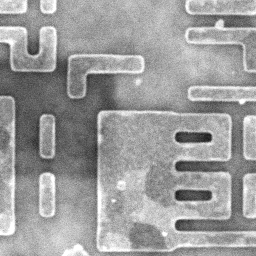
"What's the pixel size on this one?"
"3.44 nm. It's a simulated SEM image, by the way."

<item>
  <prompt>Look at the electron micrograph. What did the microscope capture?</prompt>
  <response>wiring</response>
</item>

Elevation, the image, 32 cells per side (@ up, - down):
@@@--@@----------------@@@@@@@@@
@@@---------------------@@@@@@@@
--------------------------------
@@@--@-------------------@@@----
@@@--@@----------------@@@@@@@@@
-@@--@@-----------------------@@
-@@--@@------------------------@
-@@@@@@--@@@@@@@@@-------------@
--@@@@@--@@@@@@@@@-------------@
---------@@---------------------
---------@@---------------------
---------@@-------------@@@@@@@@
@@----------------------@@@@@@@@
@@------------------------------
@@---@------@@@@@@@@@@@@@@@@----
@@---@@-----@@@@@@@@@@@@@@@@@--@
@@---@@-----@@@@@@@@@@----@@@--@
@@---@@-----@@@@@@@@@@----@@@--@
@@---@@-----@@@@@@@@@@@@@@@@@--@
@@---@------@@@@@@@@@@@@@@@@@--@
@@----------@@@@@@@@@@----------
@@----------@@@@@@@@@@@---------
@@---@@-----@@@@@@@@@@@@@@@@@--@
@@---@@-----@@@@@@@@@@@@@@@@@--@
@@---@@-----@@@@@@@@@@----@@@--@
@@---@@-----@@@@@@@@@@@@@@@@@--@
@@---@@-----@@@@@@@@@@@@@@@@@--@
@@----------@@@@@@@@@@----------
@@----------@@@@@@@@@@----------
------------@@@@@@@@@@@@@@@@@@@@
------------@@@@@@@@@@@@@@@@@@@@
--------------------------------